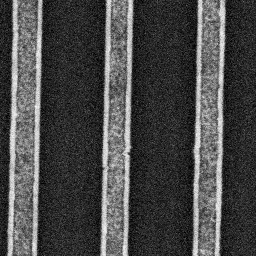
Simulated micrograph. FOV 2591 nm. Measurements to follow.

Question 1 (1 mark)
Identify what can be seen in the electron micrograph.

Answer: one or a few lines or trenches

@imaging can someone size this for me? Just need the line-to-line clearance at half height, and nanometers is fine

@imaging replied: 692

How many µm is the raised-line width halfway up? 0.239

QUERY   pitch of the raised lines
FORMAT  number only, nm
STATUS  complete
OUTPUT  929